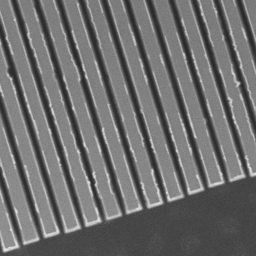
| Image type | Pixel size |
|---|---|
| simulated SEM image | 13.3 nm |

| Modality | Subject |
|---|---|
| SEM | parallel lines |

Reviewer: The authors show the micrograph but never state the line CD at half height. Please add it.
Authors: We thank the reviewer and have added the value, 188 nm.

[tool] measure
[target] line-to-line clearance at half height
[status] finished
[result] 0.101 microns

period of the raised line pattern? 281 nanometers